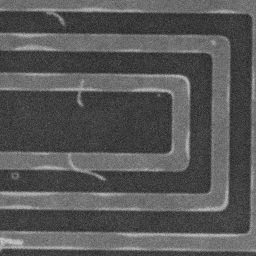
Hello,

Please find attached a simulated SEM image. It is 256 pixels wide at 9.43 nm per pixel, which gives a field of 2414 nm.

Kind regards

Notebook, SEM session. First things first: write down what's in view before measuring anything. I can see groups of lines, slits or small figures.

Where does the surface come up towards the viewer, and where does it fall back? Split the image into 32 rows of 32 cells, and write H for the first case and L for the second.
HHHHHHHHHHHHHHHHHHHHHHHHHHHHHHHH
LLLLLLLLLLLLLLLLLLLLLLLHHHHLLHHH
LLLLLLLLLLLLLLLLLLLLLLLLLLLLLLLL
LLLLLLLLLLLLLLLLLLLLLLLLLLLLLLLL
HHHHHHHHHHHHHHHHHHHHHHHHHHHHLLLL
HHHHHHHHHHHHHHHHHHHHHHHHHHHHHLLL
LLLLLLLLLLLLLLLLLLLLLLLLLHHHHLLL
LLLLLLLLLLLLLLLLLLLLLLLLLLLHHLLL
LLLLLLLLLLLLLLLLLLLLLLLLLLLHHLLL
HHHHHHHHHHHHHHHHHHHHHHLLLLLHHLLL
HHHHHHHHHHHHHHHHHHHHHHHHLLLHHLLL
LLLLLLLLLLLLLLLLLLLLLHHHLLLHHLLL
LLLLLLLLLLLLLLLLLLLLLLHHLLLHHLLL
LLLLLLLLLLLLLLLLLLLLLLHHLLLHHLLL
LLLLLLLLLLLLLLLLLLLLLLHHLLLHHLLL
LLLLLLLLLLLLLLLLLLLLLLHHLLLHHLLL
LLLLLLLLLLLLLLLLLLLLLLHHLLLHHLLL
LLLLLLLLLLLLLLLLLLLLLLHLLLLHHLLL
LLLLLLLLLLLLLLLLLLLLLLHLLLLHHLLL
HHHHHHHHHHHHHHHHHHHHHHHHLLHHHLLL
HHHHHHHHHHHHHHHHHHHHHHHHLLHHHLLL
LLLLLLLLLLLLLLLLLLLLLLLLLLHHHLLL
LLLLLLLLLLLLLLLLLLLLLLLLLLHHHLLL
LLLLLLLLLLLLLLLLLLLLLLLLLLHHLLLH
HHHHHHHHHHHHHHHHHHHHHHHHHHHHLLLH
HHHHHHHHHHHHHHHHHHHHHHHHHHHHLLLH
LLLLLLLLLLLLLLLLLLLLLLLLLLLLLLLH
LLLLLLLLLLLLLLLLLLLLLLLLLLLLLLLH
LLLLLLLLLLLLLLLLLLLLLLLLLLLLLLLH
HHHHHHHHHHHHHHHHHHHHHHHHHHHHHHHH
HHHHHHHHHHHHHHHHHHHHHHHHHHHHHHHH
LLLLLLLLLLLLLLLLLLLLLLLLLLLLLLLL